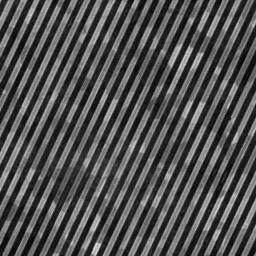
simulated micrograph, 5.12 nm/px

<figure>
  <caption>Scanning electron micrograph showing parallel lines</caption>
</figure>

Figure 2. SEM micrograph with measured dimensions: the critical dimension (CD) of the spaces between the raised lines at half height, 32.4 nanometers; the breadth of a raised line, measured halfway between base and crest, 0.0231 microns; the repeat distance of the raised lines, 58.4 nanometres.